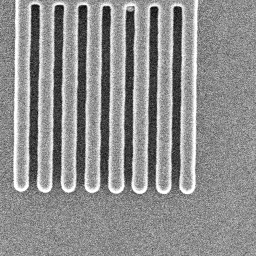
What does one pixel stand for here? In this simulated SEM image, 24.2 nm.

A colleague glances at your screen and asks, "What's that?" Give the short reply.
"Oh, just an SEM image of groups of lines, slits or small figures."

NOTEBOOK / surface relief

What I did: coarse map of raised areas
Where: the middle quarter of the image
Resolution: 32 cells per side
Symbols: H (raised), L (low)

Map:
HHHLLLHHHLLLHHHLLLHHHLLLHHHLLLHH
HHHLLLHHHLLLHHHLLLHHHLLLHHHLLLHH
HHHLLLHHHLLLHHHLLLHHHLLLHHHLLLHH
HHHLLLHHHLLLHHHLLLHHHLLLHHHLLLHH
HHHLLLHHHLLLHHHLLLHHHLLLHHHLLHHH
HHHLLLHHHLLLHHHLLLHHHLLLHHHLLHHH
HHHLLLHHHLLLHHHLLHHHHLLHHHHLLHHH
HHHLLLHHHLLLHHHLLHHHHLLHHHHLLLHH
HHHLLLHHHLLLHHHLLHHHHLLHHHHLLLHH
HHHLLLHHHLLLHHHLLHHHHLLHHHHLLLHH
HHHLLLHHHLLLHHHLLHHHHLLHHHHLLHHH
HHHLLLHHHLLLHHHLLHHHHLLHHHHLLHHH
HHHLLLHHHLLLHHHLLHHHHLLHHHHLLHHH
HHHLLLHHHLLLHHHLLHHHHLLHHHHLLHHH
HHHLLLHHHLLLHHHLLHHHHLLHHHHLLHHH
HHHLLLHHHLLLHHHLLHHHHLLHHHHLLHHH
HHHLLLHHHLLLHHHLLHHHHLLHHHHLLHHH
HHHLLLHHHLLLHHHLLHHHHLLHHHHLLHHH
HHHLLLHHHLLLHHHLLHHHHLLHHHHLLHHH
HHHLLLHHHLLLHHHLLHHHHLLHHHHLLHHH
HHHLLLHHHLLLHHHLLHHHHLLHHHHLLHHH
HHHLLLHHHLLLHHHLLHHHHLLHHHHLLHHH
HHHLLLHHHLLLHHHLLHHHHLLHHHHLLHHH
HHHLLLHHHLLHHHHLLHHHHLLHHHHLLHHH
HHHLLLHHHLLHHHHLLHHHHLLHHHHLLHHH
HHHLLLHHHLLHHHHLLHHHHLLHHHHLLHHH
HHHLLHHHHLLHHHHLLHHHHLLHHHHLLHHH
HHHLLHHHHLLHHHHLLHHHHLLHHHHLLHHH
HHHLLHHHHLLHHHHLLHHHHLLHHHHLLHHH
HHHLLHHHHLLHHHHLLHHHHLLHHHHLLHHH
HHHLLHHHHLLHHHHLLHHHHLLHHHHLLHHH
HHLLLLHHLLLLHHLLLHHHLLLLHHLLLHHH